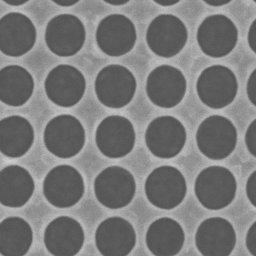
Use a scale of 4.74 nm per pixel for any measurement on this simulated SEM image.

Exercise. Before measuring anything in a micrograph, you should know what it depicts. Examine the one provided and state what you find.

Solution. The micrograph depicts a regular array of holes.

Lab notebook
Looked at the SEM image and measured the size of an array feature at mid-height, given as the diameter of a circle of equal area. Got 198 nm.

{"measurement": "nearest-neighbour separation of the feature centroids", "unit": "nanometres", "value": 239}